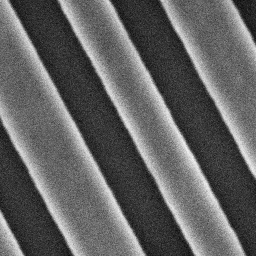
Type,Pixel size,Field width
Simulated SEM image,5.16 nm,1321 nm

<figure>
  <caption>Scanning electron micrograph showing lines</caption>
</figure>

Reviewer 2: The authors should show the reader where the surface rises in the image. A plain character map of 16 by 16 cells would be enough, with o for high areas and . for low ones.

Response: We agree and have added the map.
o...ooo...ooooo.
o...oooo...oooo.
oo...ooo...ooooo
oo....ooo...oooo
ooo...ooo...oooo
ooo....ooo...ooo
oooo...ooo....oo
ooooo...ooo...oo
.oooo...ooo....o
.ooooo...ooo...o
..oooo...ooo....
..ooooo...ooo...
...oooo...oooo..
...ooooo...ooo..
o...oooo...oooo.
o...ooooo...ooo.